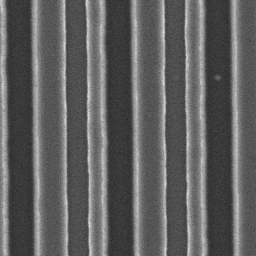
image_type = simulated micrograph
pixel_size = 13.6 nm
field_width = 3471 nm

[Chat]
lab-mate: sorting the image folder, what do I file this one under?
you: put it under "lines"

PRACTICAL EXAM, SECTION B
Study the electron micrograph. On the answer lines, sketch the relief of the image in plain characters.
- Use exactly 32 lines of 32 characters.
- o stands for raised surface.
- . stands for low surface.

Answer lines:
....ooooooooo....oooooooo....ooo
....ooooooooo....oooooooo....ooo
....ooooooooo....oooooooo....ooo
....ooooooooo....oooooooo....ooo
....ooooooooo....oooooooo....ooo
....ooooooooo....oooooooo....ooo
....ooooooooo....oooooooo....ooo
.....oooooooo....oooooooo....ooo
.....oooooooo....oooooooo....ooo
.....oooooooo....oooooooo....ooo
.....oooooooo....oooooooo....ooo
.....oooooooo....oooooooo....ooo
.....oooooooo....oooooooo....ooo
.....oooooooo....oooooooo....ooo
.....oooooooo....oooooooo.....oo
.....oooooooo....oooooooo.....oo
.....oooooooo....oooooooo.....oo
.....oooooooo....oooooooo.....oo
.....oooooooo....oooooooo.....oo
.....oooooooo....oooooooo.....oo
.....oooooooo....oooooooo.....oo
o....oooooooo....oooooooo.....oo
o....oooooooo....oooooooo.....oo
o....oooooooo....oooooooo.....oo
o....oooooooo....oooooooo.....oo
o....oooooooo....oooooooo.....oo
o....oooooooo....oooooooo.....oo
o....oooooooo....oooooooo.....oo
o....oooooooo....oooooooo.....oo
o....oooooooo....oooooooo.....oo
o....oooooooo....oooooooo.....oo
o....oooooooo....oooooooo.....oo